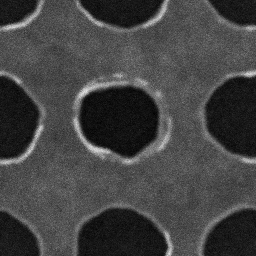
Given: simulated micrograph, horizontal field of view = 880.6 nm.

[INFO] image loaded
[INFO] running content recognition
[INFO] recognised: holes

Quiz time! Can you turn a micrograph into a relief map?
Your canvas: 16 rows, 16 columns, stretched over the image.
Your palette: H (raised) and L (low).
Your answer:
LLHHHLLLLLHHHLLL
LHHHHHHLLHHHHHHL
HHHHHHHHHHHHHHHH
HHHHHHHHHHHHHHHH
HHHHHHHHHHHHHHHH
LHHHHHHLLHHHHHLL
LLHHHLLLLLHHHLLL
LLHHHLLLLLHHHLLL
LLHHHLLLLLHHHLLL
LLHHHHHLLHHHHHLL
HHHHHHHHHHHHHHHH
HHHHHHHHHHHHHHHH
HHHHHHHHHHHHHHHH
LHHHHHLLLHHHHHLL
LLHHHLLLLLHHHLLL
LLLHHLLLLLHHHLLL